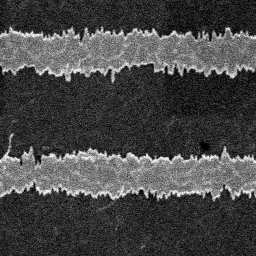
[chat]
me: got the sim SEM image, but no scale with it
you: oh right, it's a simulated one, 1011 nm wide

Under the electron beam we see one or a few lines or trenches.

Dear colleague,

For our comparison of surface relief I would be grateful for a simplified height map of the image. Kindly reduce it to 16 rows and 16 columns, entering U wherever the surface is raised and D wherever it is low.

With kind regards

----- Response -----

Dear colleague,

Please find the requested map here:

DDDDDDDDDDDDDDDD
DDDDDDDDDDDDDDDD
UUUUUUUUUUUUUUUU
UUUUUUUUUUUUUUUU
DDDUUUDDDDDDDDUD
DDDDDDDDDDDDDDDD
DDDDDDDDDDDDDDDD
DDDDDDDDDDDDDDDD
DDDDDDDDDDDDDDDD
DDDDDUDDDDDDDDDD
UUUUUUUUUUUUUUUU
UUUUUUUUUUUUUUUU
DDDDDDDDDDDDDDDD
DDDDDDDDDDDDDDDD
DDDDDDDDDDDDDDDD
DDDDDDDDDDDDDDDD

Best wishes